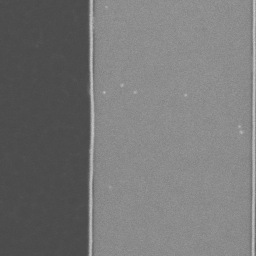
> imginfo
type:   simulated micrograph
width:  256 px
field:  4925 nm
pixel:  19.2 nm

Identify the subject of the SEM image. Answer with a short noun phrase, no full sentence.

one or a few lines or trenches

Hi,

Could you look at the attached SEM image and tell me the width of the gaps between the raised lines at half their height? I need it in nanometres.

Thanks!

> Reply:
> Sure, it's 3110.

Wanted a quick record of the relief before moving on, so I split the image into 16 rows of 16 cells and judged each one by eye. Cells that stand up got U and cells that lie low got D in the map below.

UUUUUUDDDDDDDDDD
UUUUUUDDDDDDDDDD
UUUUUUDDDDDDDDDD
UUUUUUDDDDDDDDDD
UUUUUUDDDDDDDDDD
UUUUUUDDDDDDDDDD
UUUUUUDDDDDDDDDD
UUUUUUDDDDDDDDDD
UUUUUUDDDDDDDDDD
UUUUUUDDDDDDDDDD
UUUUUUDDDDDDDDDD
UUUUUUDDDDDDDDDD
UUUUUUDDDDDDDDDD
UUUUUUDDDDDDDDDD
UUUUUUDDDDDDDDDD
UUUUUUDDDDDDDDDD